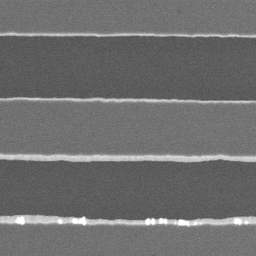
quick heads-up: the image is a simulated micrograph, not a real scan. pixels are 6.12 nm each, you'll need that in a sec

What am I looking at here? lines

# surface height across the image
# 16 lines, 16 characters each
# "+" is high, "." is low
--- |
++++++++++++++++
++++++++++++++++
................
................
................
................
++++++++++++++++
++++++++++++++++
++++++++++++++++
++++++++++++++++
................
................
................
................
++++++++++++++++
++++++++++++++++